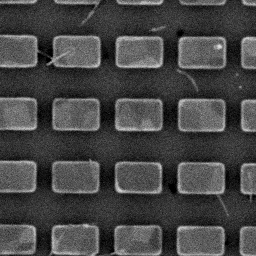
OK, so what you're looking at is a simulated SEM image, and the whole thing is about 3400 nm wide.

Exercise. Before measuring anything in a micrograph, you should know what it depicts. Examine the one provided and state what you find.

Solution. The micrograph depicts wiring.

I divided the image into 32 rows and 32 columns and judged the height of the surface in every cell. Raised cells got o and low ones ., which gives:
.......................ooooo...o
................................
................................
................................
oooo............................
ooooo..ooooo...ooooo..oooooo..oo
ooooo..ooooo...ooooo..oooooo..oo
ooooo.oooooo...ooooo..oooooo..oo
................................
................................
................................
................................
oooo...ooooo...ooooo...ooooo....
ooooo..ooooo..oooooo..oooooo..oo
ooooo..ooooo..oooooo..oooooo..oo
ooooo..ooooo..oooooo..oooooo..oo
................................
................................
................................
................................
oooo...ooooo...ooooo...ooooo...o
oooo...ooooo..oooooo..oooooo..oo
oooo...ooooo..oooooo..oooooo..oo
oooo...ooooo..oooooo..oooooo..oo
................................
................................
................................
................................
oooo...ooooo...ooooo...ooooo..oo
oooo...ooooo..oooooo..oooooo..oo
oooo...ooooo..oooooo..oooooo..oo
oooo...ooooo..oooooo..oooooo..oo